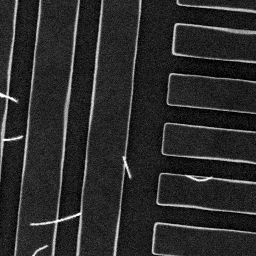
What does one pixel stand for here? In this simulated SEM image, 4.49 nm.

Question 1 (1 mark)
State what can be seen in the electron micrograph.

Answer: groups of lines, slits or small figures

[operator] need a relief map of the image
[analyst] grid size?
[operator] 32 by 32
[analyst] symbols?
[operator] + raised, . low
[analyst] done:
++...+++++...+++++....++++++++++
++...+++++...+++++..............
++...+++++...++++...............
++...++++...+++++.....+++++.....
++...++++...+++++.....++++++++++
++...++++...+++++.....++++++++++
++..+++++...+++++.....++++++++++
+...+++++...+++++...........++++
+...+++++...+++++...............
+...+++++...+++++....+++++......
+...+++++...+++++....+++++++++++
+...+++++...+++++....+++++++++++
+...++++....++++.....+++++++++++
+...++++....++++.........+++++++
+...++++...+++++................
+...++++...+++++.....++.........
...+++++...+++++....++++++++++++
...+++++...+++++....++++++++++++
...+++++...+++++....++++++++++++
...+++++...+++++......++++++++++
...+++++...+++++................
...+++++...++++.................
...+++++...++++.....+++++++++...
...+++++..+++++.....++++++++++++
...+++++..+++++.....++++++++++++
..+++++...+++++.....++++++++++++
..+++++...+++++..............+++
..+++++...+++++.................
..+++++...+++++....++++++.......
..+++++...+++++....+++++++++++++
..+++++...+++++....+++++++++++++
..+++++...++++.....+++++++++++++